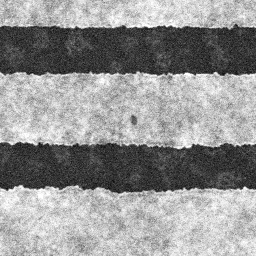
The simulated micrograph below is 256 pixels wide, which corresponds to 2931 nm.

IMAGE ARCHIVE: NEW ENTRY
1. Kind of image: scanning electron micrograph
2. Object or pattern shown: one or a few lines or trenches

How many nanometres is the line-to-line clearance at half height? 545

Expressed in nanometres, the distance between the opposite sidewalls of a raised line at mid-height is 792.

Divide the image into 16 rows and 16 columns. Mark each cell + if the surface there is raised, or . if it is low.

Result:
++++++++++++++++
++++++++++++++++
................
................
................
++++++++++++++++
++++++++++++++++
++++++++++++++++
++++++++++++++++
................
................
................
++++++++++++++++
++++++++++++++++
++++++++++++++++
++++++++++++++++